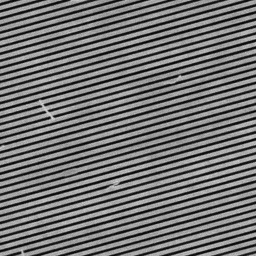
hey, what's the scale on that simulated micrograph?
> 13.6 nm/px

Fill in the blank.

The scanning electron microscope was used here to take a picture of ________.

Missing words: parallel lines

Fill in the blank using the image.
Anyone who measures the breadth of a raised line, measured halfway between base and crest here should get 58.8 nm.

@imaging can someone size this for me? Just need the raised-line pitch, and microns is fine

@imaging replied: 0.0922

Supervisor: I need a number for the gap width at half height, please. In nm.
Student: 36